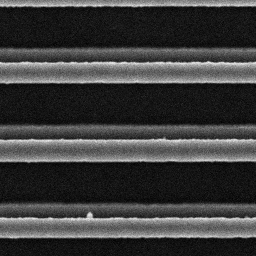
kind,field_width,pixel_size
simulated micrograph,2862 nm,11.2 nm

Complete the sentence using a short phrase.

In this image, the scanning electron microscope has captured lines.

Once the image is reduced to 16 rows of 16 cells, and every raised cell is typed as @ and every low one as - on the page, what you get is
----------------
----------------
----------------
@@@@@@@@@@@@@@@@
@@@@@@@@@@@@@@@@
----------------
----------------
----------------
@@@@@@@@@@@@@@@@
@@@@@@@@@@@@@@@@
----------------
----------------
----------------
@@@@@@@@@@@@@@@@
@@@@@@@@@@@@@@@@
----------------